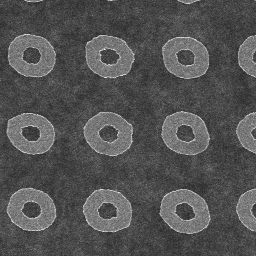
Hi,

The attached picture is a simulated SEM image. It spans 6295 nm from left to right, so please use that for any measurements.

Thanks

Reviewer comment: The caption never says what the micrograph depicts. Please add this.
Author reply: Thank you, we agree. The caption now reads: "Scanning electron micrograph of a regular array of ring-shaped raised bodies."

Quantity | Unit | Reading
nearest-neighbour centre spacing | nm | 1880